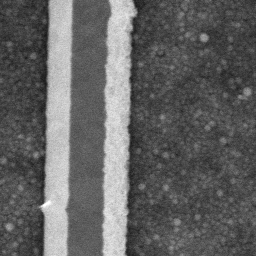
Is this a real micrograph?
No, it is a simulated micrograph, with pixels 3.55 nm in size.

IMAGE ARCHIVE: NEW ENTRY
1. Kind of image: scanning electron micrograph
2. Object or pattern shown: one or a few lines or trenches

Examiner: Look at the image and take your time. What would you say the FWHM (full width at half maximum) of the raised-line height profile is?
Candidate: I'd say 0.199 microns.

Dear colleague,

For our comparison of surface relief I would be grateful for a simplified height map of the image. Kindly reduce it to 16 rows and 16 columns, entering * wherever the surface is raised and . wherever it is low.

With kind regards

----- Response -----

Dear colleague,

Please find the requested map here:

....****........
....***.........
....***.........
....***.........
....***.........
....***.........
....***.........
....***.........
....***.........
....***.........
....***.........
....***.........
....***.........
....***.........
....***.........
....***.........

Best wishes